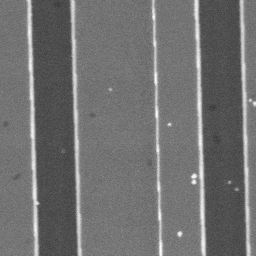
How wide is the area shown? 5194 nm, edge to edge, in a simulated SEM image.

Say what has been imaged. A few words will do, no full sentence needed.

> lines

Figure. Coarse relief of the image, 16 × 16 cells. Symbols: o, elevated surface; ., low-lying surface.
oo...ooooooo...o
oo...ooooooo...o
oo...ooooooo...o
oo...ooooooo...o
oo...ooooooo...o
oo...ooooooo...o
oo...ooooooo...o
oo...ooooooo...o
oo...oooooooo..o
oo...oooooooo..o
oo...oooooooo..o
oo...oooooooo..o
oo...oooooooo..o
oo...oooooooo..o
oo...oooooooo...
oo...oooooooo...